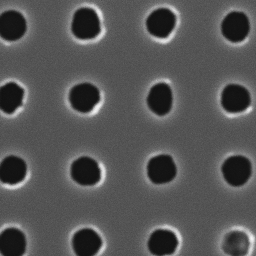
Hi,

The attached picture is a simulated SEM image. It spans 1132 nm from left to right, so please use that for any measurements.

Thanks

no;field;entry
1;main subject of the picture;a regular array of holes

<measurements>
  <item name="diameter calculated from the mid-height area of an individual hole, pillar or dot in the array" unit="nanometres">133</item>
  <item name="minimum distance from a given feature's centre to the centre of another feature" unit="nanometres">319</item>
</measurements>